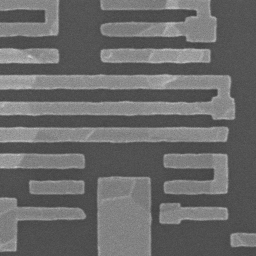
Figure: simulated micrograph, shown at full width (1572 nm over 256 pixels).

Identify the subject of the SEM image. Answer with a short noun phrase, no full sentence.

wiring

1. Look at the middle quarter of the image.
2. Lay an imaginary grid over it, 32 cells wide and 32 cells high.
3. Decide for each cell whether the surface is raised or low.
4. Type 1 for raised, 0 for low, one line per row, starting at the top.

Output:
00000000000000000000000000000000
00000000000000000000000000000000
00000000000000000000000000000000
11111111111111111111111111111111
11111111111111111111111111111111
11111111111111111111111111111111
00000000000000000000000000000000
00000000000000000000000000000000
00000000000000000000000000000000
00000000000000111000000000000000
11111111111111111111111111111111
11111111111111111111111111111111
11111111111111111111111001101111
00000000000000000000000000000000
00000000000000000000000000000000
00000000000000000000000000000000
11111111111111111111111111111111
11111111111111111111111111111111
11111111111111111111111111111111
00000000000000000000000000000000
00000000000000000000000000000000
00000000000000000000000000000000
00000000000000000000000000000000
11111000000000000000000001111111
11111000000000000000000001111111
11111000000000000000000001111111
00000000000000000000000000000000
00000000000000000000000000000000
00000000000111100000000000000000
11111000011111111111100000011111
11111000011111111111100001111111
11111000011111111111100001111111